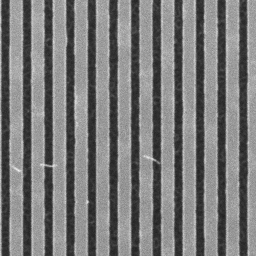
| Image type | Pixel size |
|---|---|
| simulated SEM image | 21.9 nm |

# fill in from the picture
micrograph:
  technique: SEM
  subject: parallel lines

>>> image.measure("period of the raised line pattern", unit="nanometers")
473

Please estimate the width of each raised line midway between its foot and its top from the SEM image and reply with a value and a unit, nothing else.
265 nm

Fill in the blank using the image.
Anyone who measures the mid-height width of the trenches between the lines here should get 202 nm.